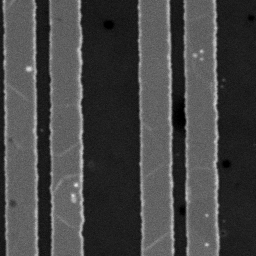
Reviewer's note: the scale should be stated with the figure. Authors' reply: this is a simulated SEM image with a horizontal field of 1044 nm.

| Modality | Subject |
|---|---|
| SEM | lines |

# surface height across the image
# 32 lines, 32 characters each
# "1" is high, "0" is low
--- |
11110011110000000111100111100000
11110011110000000111100111100000
01110011110000000111100111100000
01110011110000000111100111100000
01110011110000000111100111100000
01110011110000000111100111100000
01110011110000000111100111100000
01110011110000000111100111100000
01110011110000000111100111100000
01110011110000000111100111100000
01110011110000000111100111100000
01110011110000000111100111100000
01110011110000000011100111100000
01110011110000000011100111100000
01110011110000000011100111100000
01110011110000000011100111100000
01110011110000000011100111100000
01110011110000000011100111100000
01110011110000000011100111100000
01111011110000000011100111100000
01111001110000000011100111100000
01111011110000000011100111100000
01111001110000000011100111100000
01111011110000000011100111100000
01111011110000000011110111100000
01111011110000000011110111100000
01111011110000000011110111100000
01111001110000000011110111100000
01111001110000000011110111100000
01111001110000000011110111100000
01111001110000000011110111100000
01111001110000000011110111100000